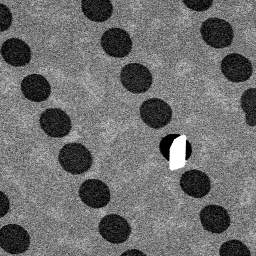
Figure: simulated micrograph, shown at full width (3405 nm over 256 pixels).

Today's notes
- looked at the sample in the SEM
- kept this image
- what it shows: a regular array of holes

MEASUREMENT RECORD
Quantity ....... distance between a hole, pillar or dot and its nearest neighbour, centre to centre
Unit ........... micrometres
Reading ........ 0.533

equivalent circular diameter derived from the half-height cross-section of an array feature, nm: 408